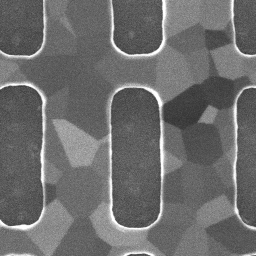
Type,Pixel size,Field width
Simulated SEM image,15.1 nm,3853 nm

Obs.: holes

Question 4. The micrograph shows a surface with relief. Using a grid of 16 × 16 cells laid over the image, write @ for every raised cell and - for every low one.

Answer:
---@@@@---@@@@@-
---@@@@---@@@@@-
---@@@@---@@@@@-
@-@@@@@@@@@@@@@@
@@@@@@@@@@@@@@@@
--@@@@@@-@@@@@@@
---@@@@---@@@@@-
---@@@@---@@@@@-
---@@@@---@@@@@-
---@@@@---@@@@@-
---@@@@---@@@@@-
---@@@@---@@@@@-
---@@@@---@@@@@-
--@@@@@---@@@@@-
@@@@@@@@@@@@@@@@
@@@@@@@@@@@@@@@@